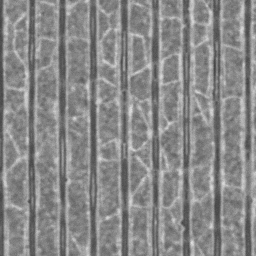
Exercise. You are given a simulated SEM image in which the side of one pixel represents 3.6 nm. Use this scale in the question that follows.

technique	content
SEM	parallel lines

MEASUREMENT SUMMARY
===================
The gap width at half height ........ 0.0288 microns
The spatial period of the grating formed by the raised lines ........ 111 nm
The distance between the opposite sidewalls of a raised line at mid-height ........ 83.6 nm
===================